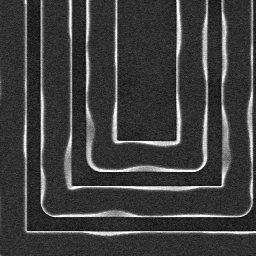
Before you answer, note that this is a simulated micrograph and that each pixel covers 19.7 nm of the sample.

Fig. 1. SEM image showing groups of lines, slits or small figures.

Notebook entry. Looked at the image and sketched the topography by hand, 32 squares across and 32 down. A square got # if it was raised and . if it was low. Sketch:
###..####..####.......####..###.
###..####..####.......####..###.
###..####..####.......####..###.
###..####..####.......####..###.
###..####..###........####..###.
###..####..###........####..###.
###..####..###........####..###.
###..####..###........####..###.
###..####..####.......####..###.
###..####..####.......####..###.
###..####..####.......####..###.
###..####..####.......####..###.
###..####..####.......####..###.
###..####..###........####..###.
###..####..###........####..###.
###..####..###........####..###.
###..####..###........####..###.
###..####..####.......####..###.
###..####..###############..###.
###..###...###############..###.
###..###...###############..###.
###..###....................###.
###..####...................###.
###..#############.....########.
###..##########################.
###..##########################.
###...#########################.
###.............................
###.............................
################################
################################
################################